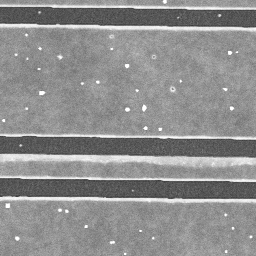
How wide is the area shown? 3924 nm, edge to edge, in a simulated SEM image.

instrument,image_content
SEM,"lines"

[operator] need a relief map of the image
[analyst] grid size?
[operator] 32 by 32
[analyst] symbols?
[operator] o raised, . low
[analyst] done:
oooooooooooooooooooooooooooooooo
................................
................................
oooooooooooooooooooooo..........
oooooooooooooooooooooooooooooooo
oooooooooooooooooooooooooooooooo
oooooooooooooooooooooooooooooooo
oooooooooooooooooooooooooooooooo
oooooooooooooooooooooooooooooooo
oooooooooooooooooooooooooooooooo
oooooooooooooooooooooooooooooooo
oooooooooooooooooooooooooooooooo
oooooooooooooooooooooooooooooooo
oooooooooooooooooooooooooooooooo
oooooooooooooooooooooooooooooooo
oooooooooooooooooooooooooooooooo
oooooooooooooooooooooooooooooooo
................................
................................
................................
oooooooooooooooooooooooooooooooo
oooooooooooooooooooooooooooooooo
....................oooooooooooo
................................
................................
oooooooooooooooooooooooooooooooo
oooooooooooooooooooooooooooooooo
oooooooooooooooooooooooooooooooo
oooooooooooooooooooooooooooooooo
oooooooooooooooooooooooooooooooo
oooooooooooooooooooooooooooooooo
oooooooooooooooooooooooooooooooo